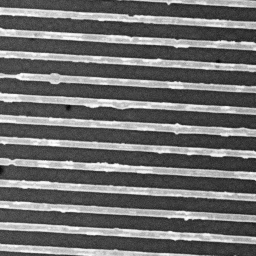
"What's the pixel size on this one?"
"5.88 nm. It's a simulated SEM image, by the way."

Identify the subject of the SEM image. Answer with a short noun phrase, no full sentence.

parallel lines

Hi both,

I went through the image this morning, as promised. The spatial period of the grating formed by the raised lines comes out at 126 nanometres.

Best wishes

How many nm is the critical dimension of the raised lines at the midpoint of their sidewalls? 37.4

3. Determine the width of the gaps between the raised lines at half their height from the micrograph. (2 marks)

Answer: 15.3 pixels